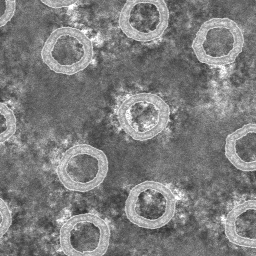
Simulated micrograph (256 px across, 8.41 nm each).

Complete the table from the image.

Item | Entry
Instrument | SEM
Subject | ring-shaped raised bodies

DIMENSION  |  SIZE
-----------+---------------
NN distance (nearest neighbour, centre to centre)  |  684 nm